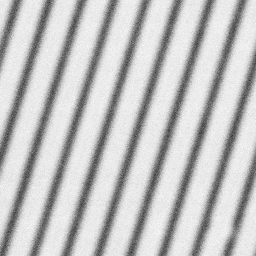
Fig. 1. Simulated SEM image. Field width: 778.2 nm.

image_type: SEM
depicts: parallel lines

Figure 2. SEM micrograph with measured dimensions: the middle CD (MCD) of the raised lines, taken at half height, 0.0663 µm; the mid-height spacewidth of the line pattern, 28.7 nm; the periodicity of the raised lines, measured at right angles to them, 0.0934 micrometres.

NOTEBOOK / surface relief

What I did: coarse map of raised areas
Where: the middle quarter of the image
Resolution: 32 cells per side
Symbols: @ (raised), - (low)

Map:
@@@@@@--@@@@@@---@@@@@---@@@@@--
@@@@@@--@@@@@@--@@@@@@--@@@@@@--
@@@@@@--@@@@@@--@@@@@@--@@@@@@--
@@@@@--@@@@@@---@@@@@---@@@@@---
@@@@@--@@@@@@--@@@@@@--@@@@@@---
@@@@@--@@@@@@--@@@@@@--@@@@@@--@
@@@@---@@@@@---@@@@@---@@@@@---@
@@@@--@@@@@@--@@@@@@--@@@@@@--@@
@@@@--@@@@@@--@@@@@@--@@@@@@--@@
@@@---@@@@@---@@@@@@--@@@@@---@@
@@@--@@@@@@--@@@@@@--@@@@@@---@@
@@@--@@@@@@--@@@@@@--@@@@@@--@@@
@@---@@@@@---@@@@@@--@@@@@@--@@@
@@--@@@@@@---@@@@@---@@@@@---@@@
@@--@@@@@@--@@@@@@--@@@@@@--@@@@
@---@@@@@---@@@@@@--@@@@@@--@@@@
@--@@@@@@---@@@@@---@@@@@---@@@@
@--@@@@@@--@@@@@@--@@@@@@--@@@@@
@--@@@@@---@@@@@@--@@@@@@--@@@@@
--@@@@@@---@@@@@---@@@@@---@@@@@
--@@@@@@--@@@@@@--@@@@@@--@@@@@@
--@@@@@@--@@@@@@--@@@@@@--@@@@@@
--@@@@@---@@@@@---@@@@@---@@@@@-
-@@@@@@--@@@@@@--@@@@@@--@@@@@@-
-@@@@@@--@@@@@@--@@@@@@--@@@@@@-
-@@@@@---@@@@@---@@@@@---@@@@@--
@@@@@@--@@@@@@--@@@@@@--@@@@@@--
@@@@@@--@@@@@@--@@@@@@--@@@@@@--
@@@@@---@@@@@@--@@@@@---@@@@@---
@@@@@---@@@@@--@@@@@@--@@@@@@---
@@@@@--@@@@@@--@@@@@@--@@@@@@--@
@@@@---@@@@@@--@@@@@@--@@@@@@--@